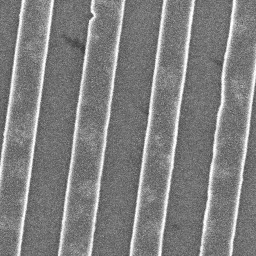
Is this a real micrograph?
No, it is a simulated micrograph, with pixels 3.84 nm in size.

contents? one or a few lines or trenches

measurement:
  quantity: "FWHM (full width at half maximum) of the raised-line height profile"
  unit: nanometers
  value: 119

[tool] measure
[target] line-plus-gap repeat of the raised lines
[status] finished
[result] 268 nm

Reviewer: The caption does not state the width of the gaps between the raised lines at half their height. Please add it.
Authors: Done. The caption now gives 153 nanometers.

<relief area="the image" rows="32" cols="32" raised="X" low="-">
---XXXX----XXXX------XXX-----XXX
---XXXX-----XXX-----XXXX-----XXX
--XXXX-----XXXX-----XXXX-----XXX
--XXXX-----XXXX-----XXXX-----XXX
--XXXX-----XXXX-----XXXX-----XXX
--XXXX-----XXXX-----XXXX----XXXX
--XXXX-----XXXX-----XXX-----XXXX
--XXXX-----XXXX-----XXX-----XXXX
--XXXX----XXXX-----XXXX-----XXXX
--XXX-----XXXX-----XXXX-----XXXX
--XXX-----XXXX-----XXXX-----XXXX
-XXXX-----XXXX-----XXXX-----XXXX
-XXXX-----XXXX-----XXXX-----XXXX
-XXXX-----XXXX-----XXX------XXX-
-XXXX-----XXXX-----XXX-----XXXX-
-XXXX----XXXX------XXX-----XXXX-
-XXXX----XXXX-----XXXX-----XXXX-
XXXX-----XXXX-----XXXX-----XXXX-
XXXX-----XXXX-----XXXX-----XXXX-
XXXX-----XXXX-----XXXX-----XXXX-
XXXX-----XXXX-----XXXX-----XXX--
XXXX-----XXXX-----XXX-----XXXX--
XXXX-----XXXX-----XXX-----XXXX--
XXXX----XXXX-----XXXX-----XXXX--
XXX-----XXXX-----XXXX-----XXXX--
XXX-----XXXX-----XXXX-----XXXX--
XXX-----XXXX-----XXXX-----XXXX--
XXX-----XXXX-----XXXX-----XXX---
XXX-----XXXX-----XXX-----XXXX---
XXX-----XXXX-----XXX-----XXXX---
XXX-----XXX-----XXXX-----XXXX---
XX-----XXXX-----XXXX-----XXXX---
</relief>